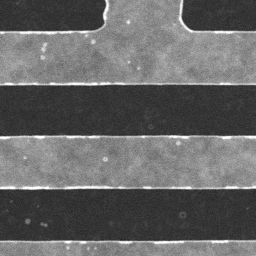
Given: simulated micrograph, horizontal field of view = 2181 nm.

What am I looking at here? one or a few lines or trenches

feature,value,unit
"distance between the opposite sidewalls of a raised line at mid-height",0.445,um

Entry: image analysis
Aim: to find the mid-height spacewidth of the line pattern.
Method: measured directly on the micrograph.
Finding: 445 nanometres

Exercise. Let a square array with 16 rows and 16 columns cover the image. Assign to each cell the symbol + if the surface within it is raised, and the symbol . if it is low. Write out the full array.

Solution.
.......++++.....
......++++++....
++++++++++++++++
++++++++++++++++
++++++++++++++++
................
................
................
................
++++++++++++++++
++++++++++++++++
++++++++++++++++
................
................
................
++++++++++++++++